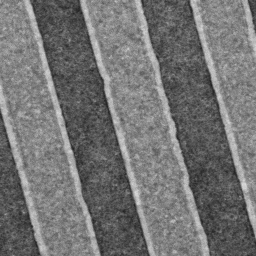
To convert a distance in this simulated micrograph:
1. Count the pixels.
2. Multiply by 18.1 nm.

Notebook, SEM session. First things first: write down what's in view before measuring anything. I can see one or a few lines or trenches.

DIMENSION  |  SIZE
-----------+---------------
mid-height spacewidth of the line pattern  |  54.7 pixels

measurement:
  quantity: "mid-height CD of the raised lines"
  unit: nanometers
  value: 924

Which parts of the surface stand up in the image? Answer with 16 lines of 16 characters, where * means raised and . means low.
**...****...***.
**....***...****
**....***....***
***...***....***
***...****...***
***....***....**
***....***....**
****...****...**
.***....***...**
.***....***....*
.****...***....*
..***...****...*
..***....***....
..***....***....
..****...****...
...***...****...